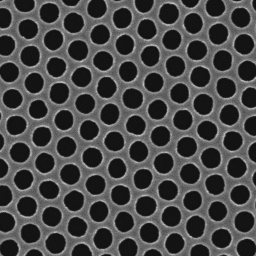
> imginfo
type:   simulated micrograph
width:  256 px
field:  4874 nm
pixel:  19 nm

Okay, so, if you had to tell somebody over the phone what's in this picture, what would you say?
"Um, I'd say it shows a regular array of holes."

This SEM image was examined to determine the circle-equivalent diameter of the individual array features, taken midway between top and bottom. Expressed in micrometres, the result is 0.382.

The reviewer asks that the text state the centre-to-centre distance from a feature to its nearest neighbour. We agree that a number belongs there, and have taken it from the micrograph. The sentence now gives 507 nanometres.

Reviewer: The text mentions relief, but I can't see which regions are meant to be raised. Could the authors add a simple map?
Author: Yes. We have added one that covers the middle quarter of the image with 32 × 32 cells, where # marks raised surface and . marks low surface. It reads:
.#######....##....###.###.....##
###...###..###....########....##
##.....#######....###...##....##
##.....##...##....##.....######.
##.....##....#######.....#######
.##...##.....#######.....##....#
.#######.....##....##...###....#
.###..###....##....#######.....#
.##....###.####.....#######....#
###.....#######.....##...###..##
###.....##...##....##.....######
###....##.....#######.....######
..###.###.....#######.....##....
..#######.....##...###...##.....
..###...##...###....#######.....
..##....#######.....########....
.###.....#######....##....###.##
####.....##...###..###.....#####
..###...##.....#######.....###..
...#######.....###..##....##....
...#######.....##....##..###....
...##....##...##.....#######....
..###.....######.....###..###...
#####.....#######....##....#####
#####....###...###.###.....#####
...###..###.....#######....###..
....#######.....###..##....##...
....#######....###....#######...
....##....##..###.....#######...
...##.....#######.....##...###..
#####.....###..###...###....####
##.###....##....#######......###